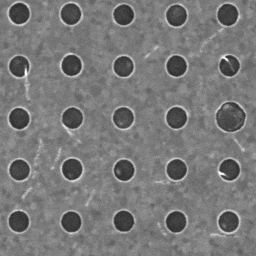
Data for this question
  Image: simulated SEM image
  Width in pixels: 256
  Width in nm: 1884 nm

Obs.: a regular array of holes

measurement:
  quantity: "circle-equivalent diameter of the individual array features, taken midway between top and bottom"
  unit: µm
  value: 0.162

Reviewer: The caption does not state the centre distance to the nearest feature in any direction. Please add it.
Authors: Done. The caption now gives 379 nm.